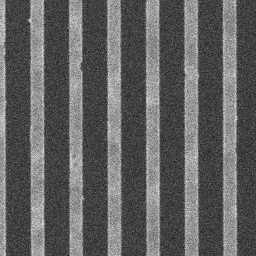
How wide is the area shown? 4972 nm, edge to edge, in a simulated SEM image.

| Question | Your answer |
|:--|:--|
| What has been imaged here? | parallel lines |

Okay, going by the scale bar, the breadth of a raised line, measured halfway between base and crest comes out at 235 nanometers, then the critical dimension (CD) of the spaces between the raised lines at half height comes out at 515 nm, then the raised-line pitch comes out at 747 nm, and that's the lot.